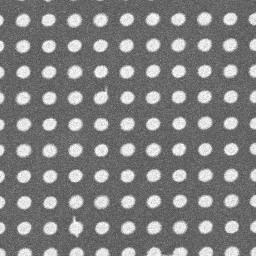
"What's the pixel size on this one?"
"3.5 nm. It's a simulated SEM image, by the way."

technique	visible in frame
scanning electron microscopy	a regular array of raised bodies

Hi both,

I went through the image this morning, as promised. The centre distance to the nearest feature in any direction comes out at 25.7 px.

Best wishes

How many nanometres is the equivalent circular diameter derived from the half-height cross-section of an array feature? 45.2